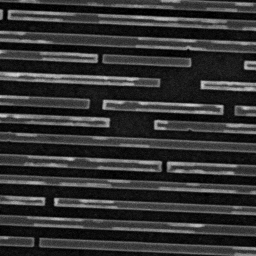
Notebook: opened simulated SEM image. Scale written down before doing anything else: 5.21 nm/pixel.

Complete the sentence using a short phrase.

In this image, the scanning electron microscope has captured parallel lines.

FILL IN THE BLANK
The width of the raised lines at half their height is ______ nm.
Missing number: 50.1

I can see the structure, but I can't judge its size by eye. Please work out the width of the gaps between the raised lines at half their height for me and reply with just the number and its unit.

59.2 nm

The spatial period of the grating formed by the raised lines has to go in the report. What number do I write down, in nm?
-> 107